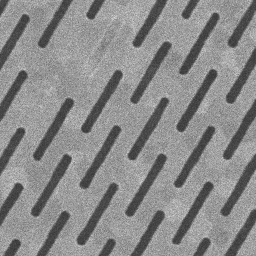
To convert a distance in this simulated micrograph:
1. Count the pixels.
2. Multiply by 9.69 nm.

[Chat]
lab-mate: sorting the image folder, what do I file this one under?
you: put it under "a regular array of holes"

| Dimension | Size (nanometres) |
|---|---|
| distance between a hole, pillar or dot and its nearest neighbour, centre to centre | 524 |